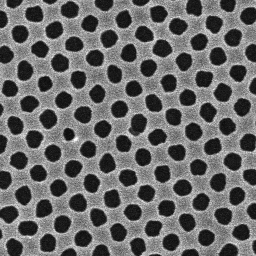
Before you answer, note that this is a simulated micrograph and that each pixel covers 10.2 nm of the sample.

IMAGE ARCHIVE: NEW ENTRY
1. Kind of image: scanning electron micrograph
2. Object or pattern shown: a regular array of holes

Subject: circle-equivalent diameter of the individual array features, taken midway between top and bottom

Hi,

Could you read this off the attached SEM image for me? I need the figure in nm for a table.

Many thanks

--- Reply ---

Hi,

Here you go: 178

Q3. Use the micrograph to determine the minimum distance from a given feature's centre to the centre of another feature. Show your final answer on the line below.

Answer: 244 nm